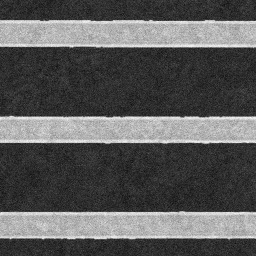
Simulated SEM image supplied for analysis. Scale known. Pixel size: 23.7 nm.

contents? lines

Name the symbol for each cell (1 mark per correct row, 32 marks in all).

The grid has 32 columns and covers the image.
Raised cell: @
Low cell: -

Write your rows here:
--------------------------------
--------------------------------
--------------------------------
@@@@@@@@@@@@@@@@@@@@@@@@@@@@@@@@
@@@@@@@@@@@@@@@@@@@@@@@@@@@@@@@@
@@@@@@@@@@@@@@@@@@@@@@@@@@@@@@@@
--------------------------------
--------------------------------
--------------------------------
--------------------------------
--------------------------------
--------------------------------
--------------------------------
--------------------------------
--------------------------------
@@@@@@@@@@@@@@@@@@@@@@@@@@@@@@@@
@@@@@@@@@@@@@@@@@@@@@@@@@@@@@@@@
@@@@@@@@@@@@@@@@@@@@@@@@@@@@@@@@
--------------------------------
--------------------------------
--------------------------------
--------------------------------
--------------------------------
--------------------------------
--------------------------------
--------------------------------
--------------------------------
@@@@@@@@@@@@@@@@@@@@@@@@@@@@@@@@
@@@@@@@@@@@@@@@@@@@@@@@@@@@@@@@@
@@@@@@@@@@@@@@@@@@@@@@@@@@@@@@@@
--------------------------------
--------------------------------